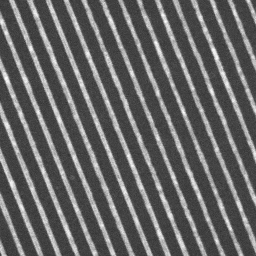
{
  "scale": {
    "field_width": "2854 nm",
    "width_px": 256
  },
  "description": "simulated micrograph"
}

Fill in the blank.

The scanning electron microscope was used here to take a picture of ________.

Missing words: parallel lines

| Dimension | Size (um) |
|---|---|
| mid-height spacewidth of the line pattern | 0.15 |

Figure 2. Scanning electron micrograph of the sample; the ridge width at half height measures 3.36 px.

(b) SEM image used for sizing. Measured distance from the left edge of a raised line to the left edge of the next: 188 nm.